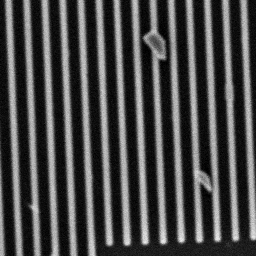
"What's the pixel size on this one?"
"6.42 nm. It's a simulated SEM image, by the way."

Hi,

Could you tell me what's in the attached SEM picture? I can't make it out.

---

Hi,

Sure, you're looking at parallel lines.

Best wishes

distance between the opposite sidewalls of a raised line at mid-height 30.5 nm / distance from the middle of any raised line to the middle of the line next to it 116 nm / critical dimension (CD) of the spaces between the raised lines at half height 0.0858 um